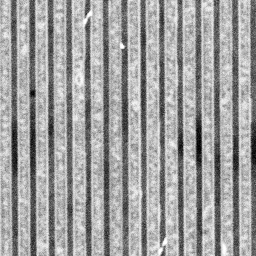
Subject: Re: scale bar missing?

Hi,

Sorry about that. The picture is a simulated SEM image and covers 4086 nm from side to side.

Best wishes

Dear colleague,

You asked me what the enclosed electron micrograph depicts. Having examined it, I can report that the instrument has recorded parallel lines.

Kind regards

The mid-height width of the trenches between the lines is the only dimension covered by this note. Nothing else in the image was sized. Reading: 0.122 um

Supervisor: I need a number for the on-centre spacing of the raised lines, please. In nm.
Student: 294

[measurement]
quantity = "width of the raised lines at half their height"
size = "184 nanometres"